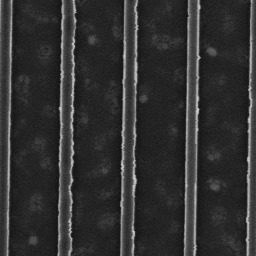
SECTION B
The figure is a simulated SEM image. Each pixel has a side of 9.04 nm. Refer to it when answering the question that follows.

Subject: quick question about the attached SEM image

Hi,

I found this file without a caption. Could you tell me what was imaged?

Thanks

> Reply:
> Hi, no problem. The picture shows one or a few lines or trenches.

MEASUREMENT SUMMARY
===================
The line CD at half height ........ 0.108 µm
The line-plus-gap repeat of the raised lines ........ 0.568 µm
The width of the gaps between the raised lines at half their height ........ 461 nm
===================